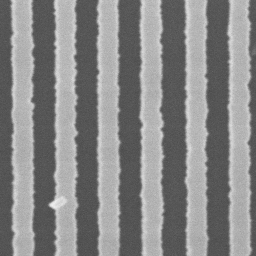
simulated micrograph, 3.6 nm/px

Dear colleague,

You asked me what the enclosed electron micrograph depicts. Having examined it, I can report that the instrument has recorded lines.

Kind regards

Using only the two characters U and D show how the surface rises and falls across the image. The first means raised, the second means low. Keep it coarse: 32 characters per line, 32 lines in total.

DUUUDDDUUDDDUUUDDDUUDDDUUUDDDUUD
DUUUDDDUUDDDUUUDDDUUDDDUUUDDDUUD
DUUUDDDUUDDDUUUDDDUUDDDUUUDDDUUD
DDUUDDDUUDDDUUUDDUUUDDDUUUDDDUUD
DDUUDDDUUDDDUUUDDDUUDDDUUUDDDUUD
DUUUDDDUUDDDUUUDDDUUDDDUUUDDDUUD
DUUUDDDUUDDDUUUDDDUUDDDUUUDDDUUD
DUUUDDDUUDDDUUUDDDUUDDDUUUDDDUUD
DDUUDDDUUDDDUUUDDDUUDDDUUUDDDUUD
DDUUDDDUUDDDUUUDDDUUDDDUUUDDDUUD
DDUUDDDUUDDDUUUDDDUUDDDUUUDDDUUD
DUUUDDDUUDDDUUUDDDUUDDDUUUDDDUUD
DDUUDDDUUUDDUUUDDDUUDDDUUUDDDUUD
DDUUDDDUUDDDUUUDDDUUDDDUUUDDDUUD
DUUUDDDUUDDDUUUDDUUUDDDUUUDDDUUD
DDUUDDDUUDDDUUUDDDUUDDDUUUDDDUUD
DDUUDDDUUUDDUUUDDDUUDDDUUUDDDUUD
DDUUDDDUUDDDUUUDDDUUDDDUUUDDDUUD
DDUUDDDUUUDDUUUDDDUUDDDUUUDDDUUD
DDUUDDDUUDDDUUUDDDUUDDDUUUDDDUUD
DDUUDDDUUUDDUUUDDDUUDDDUUUDDDUUD
DDUUDDDUUUDDUUUDDDUUDDDUUUDDDUUD
DDUUDDDUUDDDUUUDDDUUDDDUUUDDDUUD
DDUUDDDUUDDDUUUDDDUUDDDUUUDDDUUD
DDUUDDDUUDDDUUUDDDUUDDDUUUDDDUUD
DDUUDDUUUUDDUUUDDDUUDDDDUUDDDUUD
DDUUDDDUUDDDUUUDDDUUDDDUUUDDDUUD
DDUUDDDUUDDDUUUDDDUUDDDUUUDDDUUD
DDUUDDDUUUDDUUUDDDUUDDDUUUDDDUUD
DDUUDDDUUUDDUUUDDDUUDDDUUUDDDUUD
DDUUDDDUUUDDUUUDDDUUDDDUUUDDDUUD
DDUUDDDUUUDDUUUDDDUUDDDUUUDDDUUD